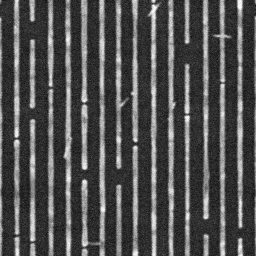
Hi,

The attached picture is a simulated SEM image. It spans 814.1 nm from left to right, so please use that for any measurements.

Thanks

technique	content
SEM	parallel lines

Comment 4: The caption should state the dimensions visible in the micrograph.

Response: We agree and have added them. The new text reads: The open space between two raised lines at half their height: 43.7 nm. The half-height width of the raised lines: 11.5 nm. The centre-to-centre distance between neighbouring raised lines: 54.5 nm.